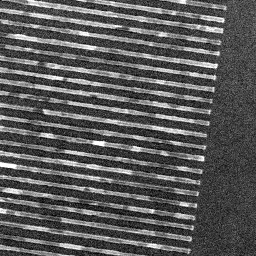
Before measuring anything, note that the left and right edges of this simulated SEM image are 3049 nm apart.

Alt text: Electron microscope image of parallel lines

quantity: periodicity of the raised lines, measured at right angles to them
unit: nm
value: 140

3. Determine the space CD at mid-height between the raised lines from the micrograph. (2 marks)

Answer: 100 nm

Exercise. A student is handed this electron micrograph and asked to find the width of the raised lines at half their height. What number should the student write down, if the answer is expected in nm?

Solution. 39.8